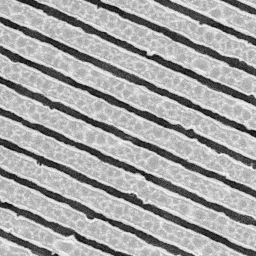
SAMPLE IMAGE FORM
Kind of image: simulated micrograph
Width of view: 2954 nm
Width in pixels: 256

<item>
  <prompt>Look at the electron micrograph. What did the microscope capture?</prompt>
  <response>parallel lines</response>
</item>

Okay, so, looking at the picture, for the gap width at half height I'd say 107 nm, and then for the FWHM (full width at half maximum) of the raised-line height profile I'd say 214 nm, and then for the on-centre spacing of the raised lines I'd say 27.8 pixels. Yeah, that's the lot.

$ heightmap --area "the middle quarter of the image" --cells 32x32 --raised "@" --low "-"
@@@@@@@------@@@@@@@@@@@------@@
@@@@@@@@@------@@@@@@@@@@@------
-@@@@@@@@@@-------@@@@@@@@@@@---
--@@@@@@@@@@@@------@@@@@@@@@@@-
----@@@@@@@@@@@@------@@@@@@@@@@
@@-----@@@@@@@@@@@------@@@@@@@@
@@@@-----@@@@@@@@@@@------@@@@@@
@@@@@@-----@@@@@@@@@@@@------@@@
@@@@@@@@@----@@@@@@@@@@@@------@
@@@@@@@@@@------@@@@@@@@@@@@----
-@@@@@@@@@@@------@@@@@@@@@@@---
----@@@@@@@@@@@-----@@@@@@@@@@@@
-----@@@@@@@@@@@@------@@@@@@@@@
@@-----@@@@@@@@@@@@------@@@@@@@
@@@@@-----@@@@@@@@@@@@-----@@@@@
@@@@@@@------@@@@@@@@@@@------@@
@@@@@@@@@------@@@@@@@@@@@------
@@@@@@@@@@@------@@@@@@@@@@@@---
-@@@@@@@@@@@@------@@@@@@@@@@@@-
----@@@@@@@@@@@@-----@@@@@@@@@@@
-------@@@@@@@@@@@------@@@@@@@@
@@@@-----@@@@@@@@@@@@-----@@@@@@
@@@@@@-----@@@@@@@@@@@@-----@@@@
@@@@@@@@-----@@@@@@@@@@@@-----@@
@@@@@@@@@@------@@@@@@@@@@------
--@@@@@@@@@@------@@@@@@@@@@@---
---@@@@@@@@@@@------@@@@@@@@@@@-
-----@@@@@@@@@@@@-----@@@@@@@@@@
@@-----@@@@@@@@@@@@@-----@@@@@@@
@@@@-----@@@@@@@@@@@@------@@@@@
@@@@@@------@@@@@@@@@@@------@@@
@@@@@@@@@-----@@@@@@@@@@@-------